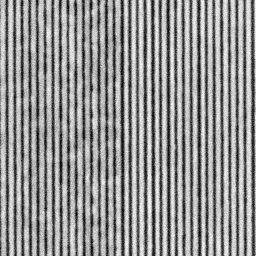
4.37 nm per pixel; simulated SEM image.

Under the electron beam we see parallel lines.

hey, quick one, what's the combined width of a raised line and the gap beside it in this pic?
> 33.5 nm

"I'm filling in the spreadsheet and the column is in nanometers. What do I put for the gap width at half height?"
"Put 12.6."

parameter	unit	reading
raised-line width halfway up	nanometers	20.7